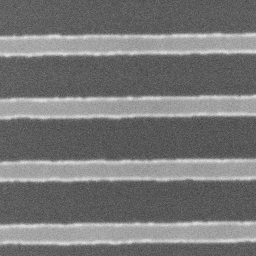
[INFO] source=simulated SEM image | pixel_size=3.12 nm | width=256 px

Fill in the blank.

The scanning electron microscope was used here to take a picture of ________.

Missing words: lines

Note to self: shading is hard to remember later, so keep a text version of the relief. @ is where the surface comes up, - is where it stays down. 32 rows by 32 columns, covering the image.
--------------------------------
--------------------------------
--------------------------------
--------------------------------
------@@--@@@@@@@@@-@@@@@@@@@@@@
@@@@@@@@@@@@@@@@@@@@@@@@@@@@@@@@
@@@@@@@@@@@@@@@@@@@@@@@@@@@@@@@@
--------------------------------
--------------------------------
--------------------------------
--------------------------------
--------------------------------
-@@@@@@@@@@@@@@@@@@@@@@@@@@@@@@@
@@@@@@@@@@@@@@@@@@@@@@@@@@@@@@@@
@@@@@@@@@@@@@@@@@---------------
--------------------------------
--------------------------------
--------------------------------
--------------------------------
--------------------------------
@@@@@@@@@@@@@@@@@@@@@@@@@@@@@@@@
@@@@@@@@@@@@@@@@@@@@@@@@@@@@@@@@
-@--@@--@-----------------------
--------------------------------
--------------------------------
--------------------------------
--------------------------------
--------------------------------
@@@@@@@@@@@@@@@@@@@@@@@@@@@@@@@@
@@@@@@@@@@@@@@@@@@@@@@@@@@@@@@@@
-------@@-----------------------
--------------------------------